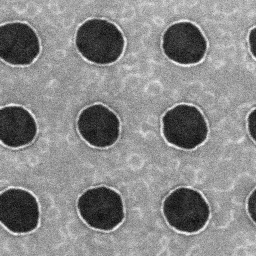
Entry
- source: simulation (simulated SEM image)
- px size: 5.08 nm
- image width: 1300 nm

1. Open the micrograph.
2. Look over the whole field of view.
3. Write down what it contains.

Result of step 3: raised bodies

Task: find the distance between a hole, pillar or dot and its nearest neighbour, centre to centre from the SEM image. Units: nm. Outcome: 424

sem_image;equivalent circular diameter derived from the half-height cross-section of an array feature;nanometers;241